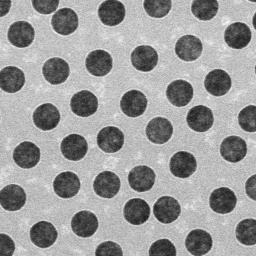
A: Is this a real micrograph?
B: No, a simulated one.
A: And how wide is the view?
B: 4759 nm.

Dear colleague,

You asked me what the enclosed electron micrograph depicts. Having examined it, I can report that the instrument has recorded a regular array of holes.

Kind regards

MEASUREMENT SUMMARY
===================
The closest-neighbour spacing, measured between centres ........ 740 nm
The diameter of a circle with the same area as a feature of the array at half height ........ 0.517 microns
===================